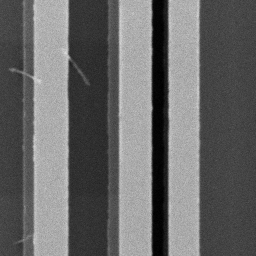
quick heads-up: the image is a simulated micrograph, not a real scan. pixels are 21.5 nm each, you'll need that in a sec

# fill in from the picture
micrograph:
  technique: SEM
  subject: lines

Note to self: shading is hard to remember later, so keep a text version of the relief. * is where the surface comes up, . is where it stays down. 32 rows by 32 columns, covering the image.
....****.......****..****.......
....****.......****..****.......
....****.......****..****.......
....****.......****..****.......
....****.......****..****.......
....****.......****..****.......
....****.......****..****.......
....*****......****..****.......
....****.......****..****.......
....****.......****..****.......
....****.......****..****.......
....****.......****..****.......
....****.......****..****.......
....****.......****..****.......
....****.......****..****.......
....****.......****..****.......
....****.......****..****.......
....****.......****..****.......
....****.......****..****.......
....****.......****..****.......
....****.......****..****.......
....****.......****..****.......
....****.......****..****.......
....****.......****..****.......
....****.......****..****.......
....****.......****..****.......
....****.......****..****.......
....****.......****..****.......
....****.......****..****.......
....****.......****..****.......
....****.......****..****.......
....****.......****..****.......